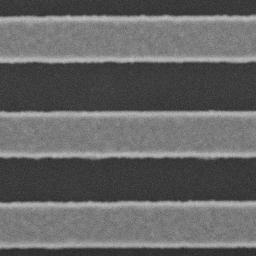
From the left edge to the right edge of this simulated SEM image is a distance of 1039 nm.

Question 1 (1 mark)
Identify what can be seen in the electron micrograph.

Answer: lines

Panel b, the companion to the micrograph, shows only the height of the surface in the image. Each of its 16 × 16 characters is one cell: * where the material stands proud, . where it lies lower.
................
****************
****************
****************
................
................
................
****************
****************
****************
................
................
................
****************
****************
**.*............